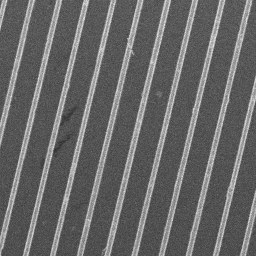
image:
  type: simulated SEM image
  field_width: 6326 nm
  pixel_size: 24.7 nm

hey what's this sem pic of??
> parallel lines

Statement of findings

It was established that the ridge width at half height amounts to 96.1 nanometres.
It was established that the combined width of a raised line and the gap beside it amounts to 653 nm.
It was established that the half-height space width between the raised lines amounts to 553 nm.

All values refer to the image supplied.